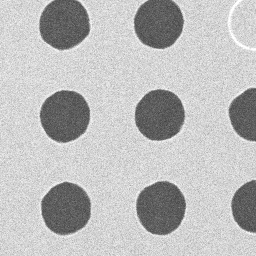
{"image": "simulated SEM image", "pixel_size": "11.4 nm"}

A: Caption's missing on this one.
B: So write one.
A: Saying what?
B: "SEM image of holes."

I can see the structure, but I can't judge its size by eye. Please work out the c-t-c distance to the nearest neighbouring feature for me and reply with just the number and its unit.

1050 nanometers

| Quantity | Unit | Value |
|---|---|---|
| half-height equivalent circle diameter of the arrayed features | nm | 586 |